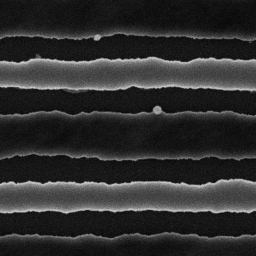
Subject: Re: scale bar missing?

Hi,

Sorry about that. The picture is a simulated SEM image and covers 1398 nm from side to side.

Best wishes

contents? lines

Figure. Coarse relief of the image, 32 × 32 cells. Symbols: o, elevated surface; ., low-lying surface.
oooooooooooooooooooooooooooooooo
oooooooooooooooooooooooooooooooo
oooooooooooooooooooooooooooooooo
oooooooooooooooooooooooooooooooo
oo.oooooooooo......ooo.ooooooooo
................................
................................
....ooo.....ooooooooo...oooooooo
oooooooooooooooooooooooooooooooo
oooooooooooooooooooooooooooooooo
oooooooooooooooooooooooooooooooo
................................
................................
...................o............
oooooooooooooooooooooooooooooooo
oooooooooooooooooooooooooooooooo
oooooooooooooooooooooooooooooooo
oooooooooooooooooooooooooooooooo
oooooooooooooooooooooooooooooooo
oo....o.oooooooooooooooooooooooo
................................
................................
.............................oo.
oooooooooooooooooooooooooooooooo
oooooooooooooooooooooooooooooooo
oooooooooooooooooooooooooooooooo
oo.....oo.................oo.oo.
................................
................................
ooooo.....oo...oooooooooo.....oo
oooooooooooooooooooooooooooooooo
oooooooooooooooooooooooooooooooo